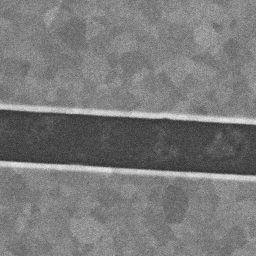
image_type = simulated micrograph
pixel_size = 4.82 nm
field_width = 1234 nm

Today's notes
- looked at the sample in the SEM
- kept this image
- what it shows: one or a few lines or trenches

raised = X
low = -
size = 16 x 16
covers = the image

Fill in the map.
XXXXXXXXXXXXXXXX
XXXXXXXXXXXXXXXX
XXXXXXXXXXXXXXXX
XXXXXXXXXXXXXXXX
XXXXXXXXXXXXXXXX
XXXXXXXXXXXXXXXX
XXXXXXXXXXXXXXXX
-------------XXX
----------------
----------------
XXXXXX----------
XXXXXXXXXXXXXXXX
XXXXXXXXXXXXXXXX
XXXXXXXXXXXXXXXX
XXXXXXXXXXXXXXXX
XXXXXXXXXXXXXXXX